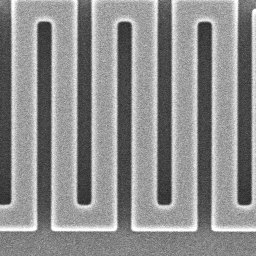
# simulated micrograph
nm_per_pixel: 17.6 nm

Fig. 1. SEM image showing groups of lines, slits or small figures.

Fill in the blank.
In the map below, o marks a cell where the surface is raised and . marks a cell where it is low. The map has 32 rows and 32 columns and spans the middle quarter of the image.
ooo....oooooo....oooooo....ooooo
ooo....oooooo....oooooo....ooooo
ooo....oooooo....oooooo....ooooo
ooo....oooooo....oooooo....ooooo
ooo....oooooo....oooooo....ooooo
ooo....oooooo....oooooo....ooooo
ooo....oooooo....oooooo....ooooo
ooo....oooooo....oooooo....ooooo
ooo....oooooo....oooooo....ooooo
ooo....oooooo....oooooo....ooooo
ooo....oooooo....oooooo....ooooo
ooo....oooooo....oooooo....ooooo
ooo....oooooo....oooooo....ooooo
ooo....oooooo....oooooo....ooooo
ooo....oooooo....oooooo....ooooo
ooo....oooooo....oooooo....ooooo
ooo....oooooo....oooooo....ooooo
ooo....oooooo....oooooo....ooooo
ooo....oooooo....oooooo....ooooo
ooo....oooooo....oooooo....ooooo
ooo....oooooo....oooooo....ooooo
ooo....oooooo....oooooo....ooooo
ooo....oooooo....oooooo....ooooo
ooo....oooooo....oooooo....ooooo
ooo....oooooo....oooooo....ooooo
ooo....oooooo....oooooo....ooooo
ooo....oooooo....oooooo....ooooo
ooo....oooooo....oooooo....ooooo
ooo....oooooo....oooooo....ooooo
ooo....oooooo....oooooo....ooooo
ooo....oooooo....oooooo....ooooo
ooo....oooooo....oooooo....ooooo